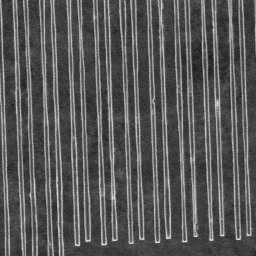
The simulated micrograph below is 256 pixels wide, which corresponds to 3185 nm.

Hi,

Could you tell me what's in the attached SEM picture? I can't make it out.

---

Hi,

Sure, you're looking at parallel lines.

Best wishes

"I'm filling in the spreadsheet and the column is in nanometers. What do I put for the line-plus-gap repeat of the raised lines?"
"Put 166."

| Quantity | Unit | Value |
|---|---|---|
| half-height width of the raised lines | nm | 51.3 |